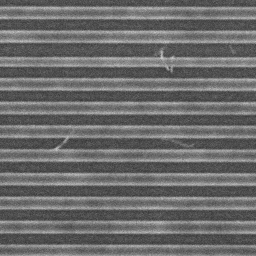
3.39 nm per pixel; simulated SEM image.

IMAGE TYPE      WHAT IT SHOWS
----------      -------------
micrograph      parallel lines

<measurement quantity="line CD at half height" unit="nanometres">40.3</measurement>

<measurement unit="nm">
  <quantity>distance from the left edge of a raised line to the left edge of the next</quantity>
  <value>80.9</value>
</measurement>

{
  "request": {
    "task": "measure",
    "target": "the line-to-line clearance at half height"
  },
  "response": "40.3 nm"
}